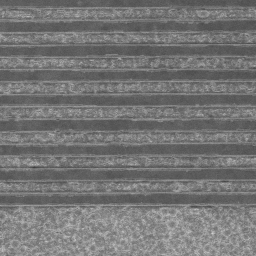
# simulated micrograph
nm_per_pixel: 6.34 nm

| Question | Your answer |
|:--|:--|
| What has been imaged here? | parallel lines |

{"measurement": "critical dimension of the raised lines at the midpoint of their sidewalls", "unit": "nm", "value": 75.3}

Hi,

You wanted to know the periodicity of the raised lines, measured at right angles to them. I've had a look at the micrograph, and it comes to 156 nm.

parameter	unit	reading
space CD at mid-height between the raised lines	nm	80.8